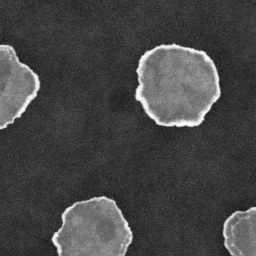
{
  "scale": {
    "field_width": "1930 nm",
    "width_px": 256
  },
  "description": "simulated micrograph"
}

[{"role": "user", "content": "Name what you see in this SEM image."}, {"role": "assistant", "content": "raised bodies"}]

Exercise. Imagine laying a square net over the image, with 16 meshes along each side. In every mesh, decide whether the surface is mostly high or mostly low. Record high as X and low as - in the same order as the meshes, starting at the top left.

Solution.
----------------
----------------
----------------
X--------XXXX---
XX-------XXXXX--
XX-------XXXXX--
XX-------XXXX---
X---------XXX---
----------------
----------------
----------------
----------------
-----XX---------
----XXXX-------X
----XXXX------XX
----XXXX------XX